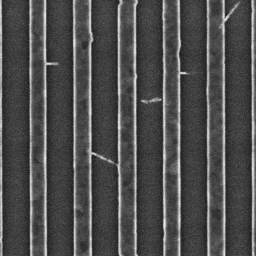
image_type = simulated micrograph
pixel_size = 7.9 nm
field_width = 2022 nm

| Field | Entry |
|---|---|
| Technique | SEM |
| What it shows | parallel lines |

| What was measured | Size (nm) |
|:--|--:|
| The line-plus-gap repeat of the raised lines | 351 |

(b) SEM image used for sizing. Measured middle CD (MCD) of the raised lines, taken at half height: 130 nm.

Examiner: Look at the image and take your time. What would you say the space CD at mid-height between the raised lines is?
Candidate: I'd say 0.224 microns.